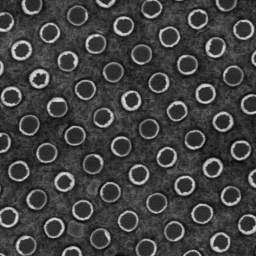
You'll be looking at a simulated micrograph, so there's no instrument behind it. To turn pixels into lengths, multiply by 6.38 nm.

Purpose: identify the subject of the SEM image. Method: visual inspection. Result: a regular array of raised bodies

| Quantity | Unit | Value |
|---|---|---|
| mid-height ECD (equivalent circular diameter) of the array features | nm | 127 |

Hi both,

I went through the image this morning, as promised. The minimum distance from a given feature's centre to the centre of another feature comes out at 211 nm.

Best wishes